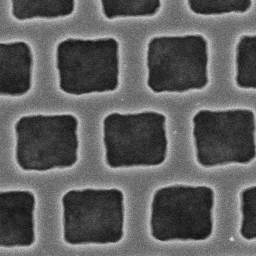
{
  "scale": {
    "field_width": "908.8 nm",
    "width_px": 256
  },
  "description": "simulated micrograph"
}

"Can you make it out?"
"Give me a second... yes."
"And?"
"holes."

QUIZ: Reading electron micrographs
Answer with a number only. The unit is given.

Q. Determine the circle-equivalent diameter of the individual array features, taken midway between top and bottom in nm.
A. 224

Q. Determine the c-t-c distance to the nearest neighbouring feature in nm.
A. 308